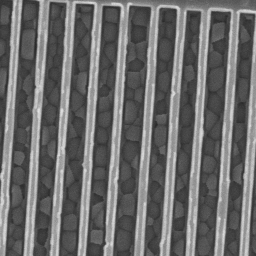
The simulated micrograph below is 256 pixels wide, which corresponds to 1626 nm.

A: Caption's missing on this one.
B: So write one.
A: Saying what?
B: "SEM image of parallel lines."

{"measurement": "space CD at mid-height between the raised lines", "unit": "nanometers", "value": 115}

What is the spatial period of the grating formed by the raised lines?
0.172 micrometres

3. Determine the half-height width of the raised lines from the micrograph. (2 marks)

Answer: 54.7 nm